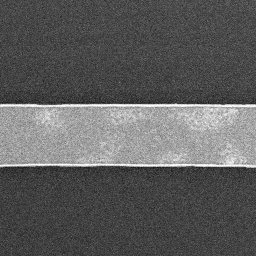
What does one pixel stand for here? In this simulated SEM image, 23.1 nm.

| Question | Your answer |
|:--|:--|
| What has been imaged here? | one or a few lines or trenches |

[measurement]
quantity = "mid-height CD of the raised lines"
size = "1.37 microns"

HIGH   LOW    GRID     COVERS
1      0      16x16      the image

0000000000000000
0000000000000000
0000000000000000
0000000000000000
0000000000000000
0000000000000000
0000000000000000
1111111111111111
1111111111111111
1111111111111111
0000000000000000
0000000000000000
0000000000000000
0000000000000000
0000000000000000
0000000000000000